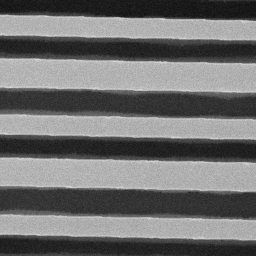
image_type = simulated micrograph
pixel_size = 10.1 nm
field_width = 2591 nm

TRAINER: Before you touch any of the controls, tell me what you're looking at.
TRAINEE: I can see lines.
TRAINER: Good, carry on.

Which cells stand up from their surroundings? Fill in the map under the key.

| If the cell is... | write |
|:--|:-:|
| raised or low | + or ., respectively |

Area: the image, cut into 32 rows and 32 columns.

................................
................................
+++++++++++++++++++++++++++.....
++++++++++++++++++++++++++++++++
...+++++++++++++++++++++++++++++
................................
................................
++++++++++++....................
++++++++++++++++++++++++++++++++
++++++++++++++++++++++++++++++++
++++++++++++++++++++++++++++++++
..........................++++++
................................
................................
++++++++++++....................
++++++++++++++++++++++++++++++++
++++++++++++++++++++++++++++++++
................................
................................
................................
++++++++++++++++++++++++++++++++
++++++++++++++++++++++++++++++++
++++++++++++++++++++++++++++++++
..............++++++++++++++++++
................................
................................
................................
+++++++++++++++++++++++++++++++.
++++++++++++++++++++++++++++++++
........++++++++++++++++++++++++
................................
................................